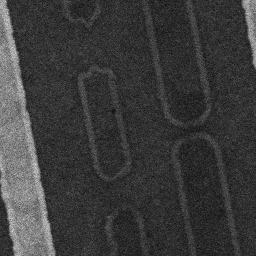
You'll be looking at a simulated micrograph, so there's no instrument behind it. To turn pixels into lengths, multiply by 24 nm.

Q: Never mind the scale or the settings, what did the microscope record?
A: one or a few lines or trenches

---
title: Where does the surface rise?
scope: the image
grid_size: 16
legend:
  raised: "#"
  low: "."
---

....##...###...#
.........###....
#.........##....
#.........##....
#.....#...###...
#....##...###...
#....##...###...
##....#....#....
##....##........
##....##...###..
##....##...###..
##.........###..
###........###..
.##....##...##..
.##....##...###.
.##....##...###.